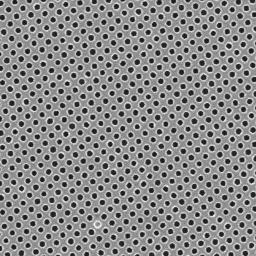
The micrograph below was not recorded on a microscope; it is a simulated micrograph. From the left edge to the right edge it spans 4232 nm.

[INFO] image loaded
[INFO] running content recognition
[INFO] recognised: a regular array of holes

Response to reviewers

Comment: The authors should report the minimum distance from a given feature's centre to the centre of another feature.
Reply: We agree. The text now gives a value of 164 nm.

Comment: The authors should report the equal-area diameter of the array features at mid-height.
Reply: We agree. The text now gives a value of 98.7 nm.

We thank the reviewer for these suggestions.